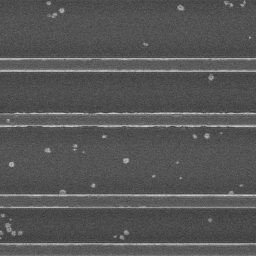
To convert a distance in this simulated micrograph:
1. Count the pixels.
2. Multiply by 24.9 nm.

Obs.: lines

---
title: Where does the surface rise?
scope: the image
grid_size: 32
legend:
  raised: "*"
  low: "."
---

................................
................................
................................
................................
................................
................................
................................
********************************
********************************
................................
................................
................................
................................
................................
********************************
********************************
................................
................................
................................
................................
................................
................................
................................
................................
********************************
********************************
................................
................................
................................
................................
................................
********************************